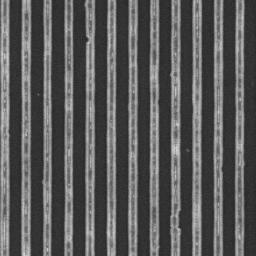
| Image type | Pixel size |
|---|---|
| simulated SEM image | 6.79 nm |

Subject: parallel lines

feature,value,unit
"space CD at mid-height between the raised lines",14.6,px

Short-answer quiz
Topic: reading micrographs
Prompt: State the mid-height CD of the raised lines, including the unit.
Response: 0.0467 um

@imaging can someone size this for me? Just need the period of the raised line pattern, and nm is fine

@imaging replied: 145